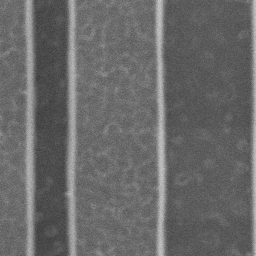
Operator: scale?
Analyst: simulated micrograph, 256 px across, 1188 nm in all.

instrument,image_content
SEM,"one or a few lines or trenches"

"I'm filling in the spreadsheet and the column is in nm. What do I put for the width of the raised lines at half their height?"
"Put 416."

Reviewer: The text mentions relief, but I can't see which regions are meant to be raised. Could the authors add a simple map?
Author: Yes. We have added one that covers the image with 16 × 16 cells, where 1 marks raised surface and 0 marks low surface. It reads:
1100111111000000
1100111111000000
1100111111000000
1100111111000000
1100111111000000
1100111111000000
1100111111000000
1100111111000000
1100111111000000
1100111111000000
1100111111000000
1100111111000000
1100111111000000
1100111111000000
1100011111000000
1100011111000000